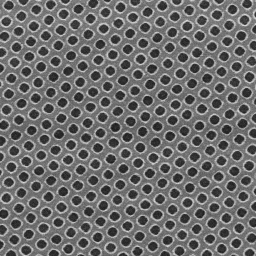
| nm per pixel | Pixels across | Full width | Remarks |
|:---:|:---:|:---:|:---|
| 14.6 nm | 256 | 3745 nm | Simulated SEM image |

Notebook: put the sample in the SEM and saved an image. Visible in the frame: a regular array of holes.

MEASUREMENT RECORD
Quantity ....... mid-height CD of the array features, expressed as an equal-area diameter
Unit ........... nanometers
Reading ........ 150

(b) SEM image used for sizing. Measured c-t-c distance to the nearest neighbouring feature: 225 nanometers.